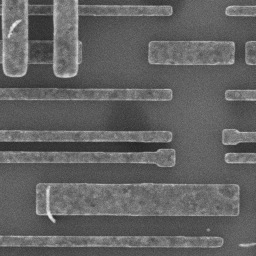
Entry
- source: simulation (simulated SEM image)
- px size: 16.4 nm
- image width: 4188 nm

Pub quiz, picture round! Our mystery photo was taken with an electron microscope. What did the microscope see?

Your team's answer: wiring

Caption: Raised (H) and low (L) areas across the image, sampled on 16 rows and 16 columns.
HHLHHLLLLLLLLLLL
HHLHHLLLLLLLLLLL
HHLHHLLLLLLLLLLL
HHLHHLLLLLLLLLLL
HHLHHLLLLLLLLLLL
LLLLLLLLLLLLLLLL
LLLLLLLLLLLLLLLL
LLLLLLLLLLLLLLLL
LLLLLLLLLLLLLLLL
LLLLLLLLLLLLLLLL
LLLLLLLLLLLLLLLL
LLLLLLLLLLLLLLLL
LLLLLLLLLLLLLLLL
LLLLLLLLLLLLLLLL
LLLLLLLLLLLLLLLL
LLLLLLLLLLLLLLLL